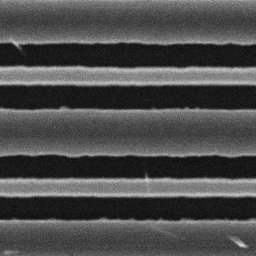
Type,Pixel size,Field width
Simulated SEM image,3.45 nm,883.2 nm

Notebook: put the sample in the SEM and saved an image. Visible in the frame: lines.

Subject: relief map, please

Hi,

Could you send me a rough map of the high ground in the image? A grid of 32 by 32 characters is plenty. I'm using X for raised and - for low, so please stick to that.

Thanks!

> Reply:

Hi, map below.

XXXXXXXXXXXXXXXXXXXXXXXXXXXXXXXX
XXXXXXXXXXXXXXXXXXXXXXXXXXXXXXXX
XXXXXXXXXXXXXXXXXXXXXXXXXXXXXXXX
XXXXXXXXXXXXXXXXXXXXXXXXXXXXXXXX
XXXXXXXXXXXXXXXXXXXXXXXXXXXXXXXX
--X-----------------X---------X-
--------------------------------
--------------------------------
XXXXXXXXXXXXXXX-----XX-XXXXX---X
XXXXXXXXXXXXXXXXXXXXXXXXXXXXXXXX
XXXXXXXXXXXXXXXXXXXXXXXXXXXXXXXX
--------------------------------
--------------------------------
--------------------------------
XXXXXXXXXXXXXXXXXXXXXXXXXXXXXXXX
XXXXXXXXXXXXXXXXXXXXXXXXXXXXXXXX
XXXXXXXXXXXXXXXXXXXXXXXXXXXXXXXX
XXXXXXXXXXXXXXXXXXXXXXXXXXXXXXXX
XXXXXXXXXXXXXXXXXXXXXXXXXXXXXXXX
--------XX------------X-----XX--
--------------------------------
--------------------------------
XXXXXXXXXXXXXXXXXXXXXXXXXXXXXXXX
XXXXXXXXXXXXXXXXXXXXXXXXXXXXXXXX
XXXXXX-XXXXXXXXXXXXXXXXXXXXXXXXX
--------------------------------
--------------------------------
--------------------------------
XXXXXXXXXXXXXXXXXXXXXXXXXXXXXXXX
XXXXXXXXXXXXXXXXXXXXXXXXXXXXXXXX
XXXXXXXXXXXXXXXXXXXXXXXXXXXXXXXX
XXXXXXXXXXXXXXXXXXXXXXXXXXXXXXXX